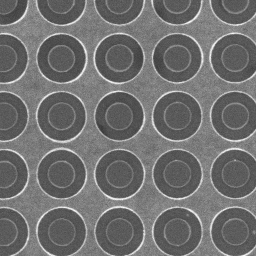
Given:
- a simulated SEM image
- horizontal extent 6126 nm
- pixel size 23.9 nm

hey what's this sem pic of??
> an array of small figures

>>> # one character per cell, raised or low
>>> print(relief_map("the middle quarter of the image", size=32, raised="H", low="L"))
HHLLLHHHLLLHHHHHLLLLHHLLLLHHHHHL
HLLLLHHHLLLLLHHLLLLHHHHLLLLHHHLL
LLLLHHHHHLLLLLLLLLLHHHHHLLLLLLLL
LLLHHHHHHHLLLLLLLHHHHHHHHLLLLLLL
LHHHHHHHHHHHLLLHHHHHHHHHHHHLLLHH
HHHHHHHHHHHHHHHHHHHHHHHHHHHHHHHH
HHHHHHHHHHHHHHHHHHHHHHHHHHHHHHHH
LLHHHHHHHHHLLLLLHHHHHHHHHHLLLLLH
LLLHHHHHHHLLLLLLLLHHHHHHLLLLLLLL
LLLLLHHHHLLLLLLLLLLHHHHLLLLLLLLL
HHLLLHHHLLLLHHHHLLLLHHHLLLHHHHHL
HHLLLHHHLLLHHHHHHLLLHHLLLLHHHHHL
HHHLLLHHLLLHHHHHHLLLHHLLLHHHHHHH
HHHLLLHHLLLHHHHHHLLLHHLLLHHHHHHH
HHLLLHHHLLLHHHHHHLLLHHLLLLHHHHHL
HHLLLHHHLLLLHHHHLLLLHHLLLLHHHHHL
LLLLLHHHHLLLLLLLLLLHHHHLLLLLLLLL
LLLLHHHHHHLLLLLLLLHHHHHHLLLLLLLL
LLLHHHHHHHHLLLLLLHHHHHHHHLLLLLLH
HHHHHHHHHHHHHHHHHHHHHHHHHHHHHHHH
HHHHHHHHHHHHHHHHHHHHHHHHHHHHHHHH
LHHHHHHHHHHHLLLHHHHHHHHHHHHLLLHH
LLLHHHHHHHLLLLLLLHHHHHHHHLLLLLLL
LLLLHHHHHLLLLLLLLLHHHHHHLLLLLLLL
LLLLLHHHHLLLLHHLLLLHHHHLLLLHHHLL
HHLLLHHHLLLHHHHHHLLLHHLLLLHHHHHL
HHLLLLHHLLLHHHHHHLLLHHLLLHHHHHHH
HHLLLLHHLLLHHHHHHLLLHHLLLHHHHHHH
HHLLLLHHLLLHHHHHHLLLHHLLLHHHHHHH
HHLLLHHHLLLHHHHHHLLLHHLLLLHHHHHL
HLLLLHHHLLLLLHHLLLLHHHHLLLLHHHLL
LLLLHHHHHLLLLLLLLLLHHHHHLLLLLLLL